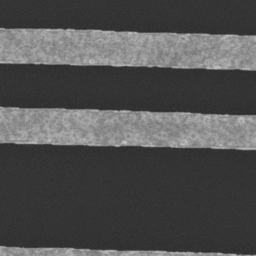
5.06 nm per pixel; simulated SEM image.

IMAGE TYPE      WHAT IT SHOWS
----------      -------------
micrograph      lines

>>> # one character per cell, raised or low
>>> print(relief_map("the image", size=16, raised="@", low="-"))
----------------
----------------
@@@@@@@@@@@@@@@@
@@@@@@@@@@@@@@@@
----------------
----------------
----------------
@@@@@@@@@@@@@@@@
@@@@@@@@@@@@@@@@
----------------
----------------
----------------
----------------
----------------
----------------
@@--------------